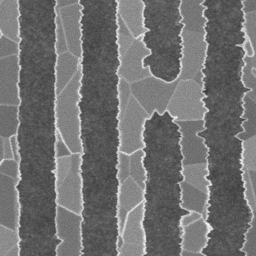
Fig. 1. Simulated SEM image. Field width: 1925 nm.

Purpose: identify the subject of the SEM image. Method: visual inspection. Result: one or a few lines or trenches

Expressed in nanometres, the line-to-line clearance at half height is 272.